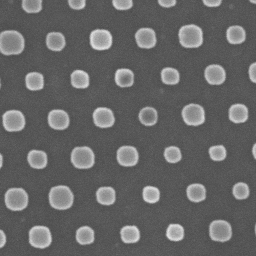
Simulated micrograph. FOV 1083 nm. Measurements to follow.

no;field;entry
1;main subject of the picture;a regular array of raised bodies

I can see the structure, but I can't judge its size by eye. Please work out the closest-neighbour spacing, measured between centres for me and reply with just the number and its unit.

190 nm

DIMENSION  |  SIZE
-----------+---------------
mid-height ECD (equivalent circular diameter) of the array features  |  80 nm